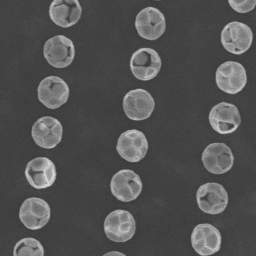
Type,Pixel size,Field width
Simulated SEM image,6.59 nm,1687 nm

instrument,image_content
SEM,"a regular array of raised bodies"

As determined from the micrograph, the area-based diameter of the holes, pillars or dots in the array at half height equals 28.8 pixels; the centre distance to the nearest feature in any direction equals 266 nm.